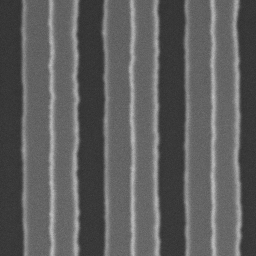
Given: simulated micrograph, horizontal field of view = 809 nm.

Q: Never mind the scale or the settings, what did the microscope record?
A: lines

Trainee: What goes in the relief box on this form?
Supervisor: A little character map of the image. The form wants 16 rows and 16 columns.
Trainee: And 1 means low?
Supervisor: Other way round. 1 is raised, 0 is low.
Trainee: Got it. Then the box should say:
0111100111001110
0111101111001110
0111101111001110
0111100111001110
0111100111001110
0111100111001110
0111100111001110
0111100111001110
0111100111001110
0111100111001110
0111100111001110
0011100111001110
0111100111001110
0111100111001110
0011100111001110
0011100111001110